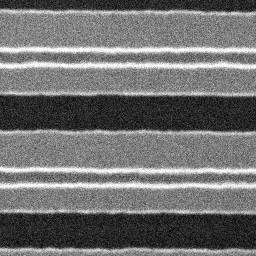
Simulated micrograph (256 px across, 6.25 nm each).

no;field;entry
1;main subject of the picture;lines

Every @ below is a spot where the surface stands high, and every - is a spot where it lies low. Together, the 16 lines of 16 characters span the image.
----------------
@@@@@@@@@@@@@@@@
@@@@@@@@@@@@@@@@
@@@@@@@@@@@@@@@@
@@@@@@@@@@@@@@@@
@@@@@@@@@@@@@@@@
----------------
----------------
@@@@@@@@@@@@@@@@
@@@@@@@@@@@@@@@@
@@@@@@@@@@@@@@@@
@@@@@@@@@@@@@@@@
@@@@@@@@@@@@@@@@
----------------
----------------
----------------